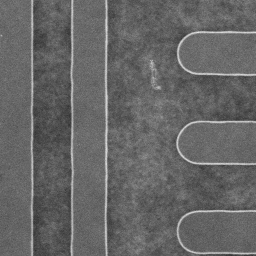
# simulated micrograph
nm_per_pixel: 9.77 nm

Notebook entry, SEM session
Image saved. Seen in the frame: groups of lines, slits or small figures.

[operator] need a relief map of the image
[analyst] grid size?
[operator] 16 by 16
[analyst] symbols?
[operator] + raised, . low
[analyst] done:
++...++.........
++...++.........
++...++....+++++
++...++....+++++
++..+++.....++++
++...++.........
++...++.........
++...++.........
++...++....+++++
++...++....+++++
++...++.........
++...++.........
++...++.........
++...++.....++++
++...++....+++++
++..+++.....++++